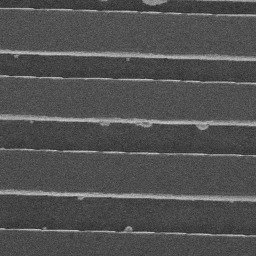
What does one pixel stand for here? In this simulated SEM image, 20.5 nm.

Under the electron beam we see lines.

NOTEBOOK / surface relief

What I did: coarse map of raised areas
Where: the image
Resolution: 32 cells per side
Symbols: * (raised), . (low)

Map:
................................
*****************...............
********************************
********************************
********************************
********************************
..******************************
................................
................................
*...............................
********************************
********************************
********************************
********************************
********************************
................................
................................
................................
................................
*******************************.
********************************
********************************
********************************
********************************
.................***************
................................
................................
................................
................................
*******************************.
********************************
********************************